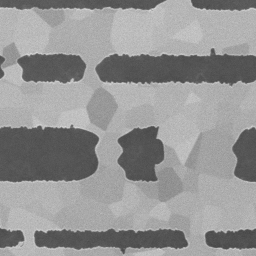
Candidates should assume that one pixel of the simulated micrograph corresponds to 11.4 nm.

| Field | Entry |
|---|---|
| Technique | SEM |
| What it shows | one or a few lines or trenches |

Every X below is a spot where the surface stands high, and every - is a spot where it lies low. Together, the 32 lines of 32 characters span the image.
--------------------XXXX--------
XXXXXXXXXXXXXXXXXXXXXXXXXXXXXXXX
XXXXXXXXXXXXXXXXXXXXXXXXXXXXXXXX
XXXXXXXXXXXXXXXXXXXXXXXXXXXXXXXX
XXXXXXXXXXXXXXXXXXXXXXXXXXXXXXXX
XXXXXXXXXXXXXXXXXXXXXXXXXXXXXXXX
XXXXXXXXXXXXXXXXXXXXXXXXXX-XXXXX
-X--------XXX-------------------
XXX--------X--------------------
XXX-------XX--------------------
XXXXXXXXXXXXXXXXXXXXXXXXXXXX-XXX
XXXXXXXXXXXXXXXXXXXXXXXXXXXXXXXX
XXXXXXXXXXXXXXXXXXXXXXXXXXXXXXXX
XXXXXXXXXXXXXXXXXXXXXXXXXXXXXXXX
XXXXXXXXXXXXXXXXXXXXXXXXXXXXXXXX
XXXXXXXXXXXXXXXXXXXXXXXXXXXXXXXX
-----------XXXXX----XXXXXXXXXX--
------------XXX-----XXXXXXXXXX--
------------XXX------XXXXXXXX---
------------XXX------XXXXXXXX---
--X---------XXX-----XXXXXXXXXX--
------------XXXX---XXXXXXXXXX---
----------XXXXXX----XXXXXXXXXX--
XXXXXXXXXXXXXXXXXXXXXXXXXXXXXXXX
XXXXXXXXXXXXXXXXXXXXXXXXXXXXXXXX
XXXXXXXXXXXXXXXXXXXXXXXXXXXXXXXX
XXXXXXXXXXXXXXXXXXXXXXXXXXXXXXXX
XXXXXXXXXXXXXXXXXXXXXXXXXXXXXXXX
XXXXXXXXXXXXXXXXXXXXXXXXXXXXXXXX
---X-------------------XXX------
---X--------------------XX------
XXXXXXXXXXXXXXXXXXXXXXXXXXXXXXXX